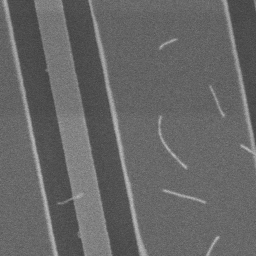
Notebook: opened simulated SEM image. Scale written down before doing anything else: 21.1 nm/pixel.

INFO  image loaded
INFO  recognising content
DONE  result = lines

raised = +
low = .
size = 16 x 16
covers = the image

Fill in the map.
+.....++++++++..
+.....++++++++..
+.....+++++++++.
+.....+++++++++.
+......++++++++.
++.....++++++++.
++.....++++++++.
++.....+++++++++
++.....+++++++++
++.....+++++++++
++......++++++++
+++.....++++++++
+++.....++++++++
+++.....++++++++
+++.....++++++++
+++......+++++++